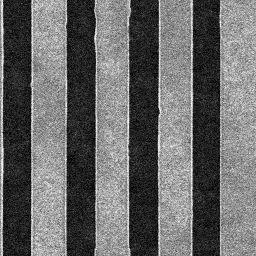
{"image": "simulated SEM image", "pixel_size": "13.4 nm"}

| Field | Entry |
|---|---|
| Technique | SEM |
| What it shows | one or a few lines or trenches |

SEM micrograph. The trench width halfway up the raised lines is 402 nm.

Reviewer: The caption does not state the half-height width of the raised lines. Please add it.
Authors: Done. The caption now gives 439 nm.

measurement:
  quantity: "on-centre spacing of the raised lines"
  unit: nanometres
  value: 847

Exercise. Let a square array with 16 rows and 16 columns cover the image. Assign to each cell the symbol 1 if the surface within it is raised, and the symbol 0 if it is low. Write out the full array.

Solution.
0011001100110011
0011001100110011
0011001100110011
0011001100110011
0011001100110011
0011001100110011
0011001100110011
0011001100110011
0011001100110011
0011001100110011
0011001100110011
0011001100110011
0011001100110011
0011001100110011
0011001100110011
0011001100110011